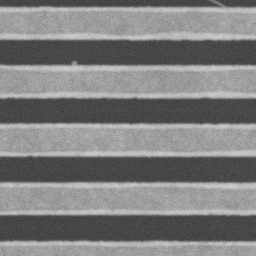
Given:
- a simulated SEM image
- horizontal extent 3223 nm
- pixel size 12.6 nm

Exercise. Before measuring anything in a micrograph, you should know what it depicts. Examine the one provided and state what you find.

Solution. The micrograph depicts lines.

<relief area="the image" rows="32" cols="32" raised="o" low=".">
................................
oooooooooooooooooooooooooooooooo
oooooooooooooooooooooooooooooooo
oooooooooooooooooooooooooooooooo
oooooooooooooooooooooooooooooooo
................................
................................
................................
oooooooooooooooooooooooooooooooo
oooooooooooooooooooooooooooooooo
oooooooooooooooooooooooooooooooo
oooooooooooooooooooooooooooooooo
................................
................................
................................
................................
oooooooooooooooooooooooooooooooo
oooooooooooooooooooooooooooooooo
oooooooooooooooooooooooooooooooo
................................
................................
................................
................................
oooooooooooooooooooooooooooooooo
oooooooooooooooooooooooooooooooo
oooooooooooooooooooooooooooooooo
oooooooooooooooooooooooooooooooo
................................
................................
................................
oooooooooooooooooooooooooooooooo
oooooooooooooooooooooooooooooooo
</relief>